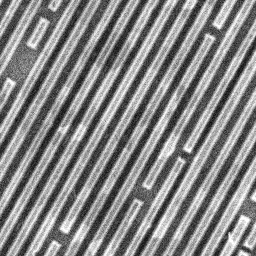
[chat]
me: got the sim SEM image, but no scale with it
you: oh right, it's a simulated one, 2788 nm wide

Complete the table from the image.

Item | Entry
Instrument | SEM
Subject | parallel lines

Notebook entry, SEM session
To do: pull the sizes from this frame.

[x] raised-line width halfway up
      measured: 88 nm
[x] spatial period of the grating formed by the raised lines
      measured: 185 nanometres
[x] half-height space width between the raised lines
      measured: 0.0975 microns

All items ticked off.